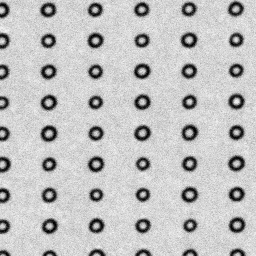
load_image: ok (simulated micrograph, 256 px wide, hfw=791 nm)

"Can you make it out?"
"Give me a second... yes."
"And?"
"a regular array of ring-shaped grooves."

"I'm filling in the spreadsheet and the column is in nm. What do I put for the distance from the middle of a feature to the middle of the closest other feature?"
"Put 95.2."